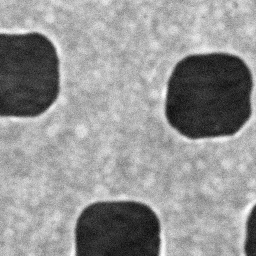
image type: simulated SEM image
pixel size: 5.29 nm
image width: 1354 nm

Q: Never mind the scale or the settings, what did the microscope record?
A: holes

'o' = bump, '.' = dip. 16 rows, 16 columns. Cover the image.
oooooooooooooooo
oooooooooooooooo
...ooooooooooooo
....oooooooo...o
....ooooooo.....
....oooooo......
...ooooooo......
oooooooooo.....o
ooooooooooo...oo
oooooooooooooooo
oooooooooooooooo
oooooooooooooooo
oooooooooooooooo
ooooo.....ooooo.
ooooo.....ooooo.
ooooo.....ooooo.